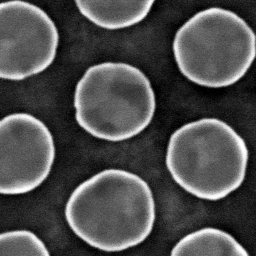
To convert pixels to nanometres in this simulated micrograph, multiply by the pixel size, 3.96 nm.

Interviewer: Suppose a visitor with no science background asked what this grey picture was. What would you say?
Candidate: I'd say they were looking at raised bodies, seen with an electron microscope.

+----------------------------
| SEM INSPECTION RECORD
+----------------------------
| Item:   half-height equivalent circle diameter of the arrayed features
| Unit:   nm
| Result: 309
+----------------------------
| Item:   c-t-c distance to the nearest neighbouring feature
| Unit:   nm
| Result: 432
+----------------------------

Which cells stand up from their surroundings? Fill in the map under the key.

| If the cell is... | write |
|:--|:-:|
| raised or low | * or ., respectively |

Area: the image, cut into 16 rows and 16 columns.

**...****.......
***...**....***.
****.......*****
***........*****
**...****..****.
.....****.......
.....*****......
**...****.......
***...**...****.
***........****.
***........****.
**...****..****.
....******......
....******......
.....****....*..
***...**...****.